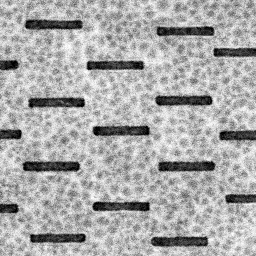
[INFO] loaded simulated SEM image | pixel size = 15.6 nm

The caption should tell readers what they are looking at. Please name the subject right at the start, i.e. a regular array of holes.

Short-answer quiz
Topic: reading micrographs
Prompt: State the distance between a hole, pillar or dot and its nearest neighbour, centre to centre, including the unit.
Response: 1030 nm